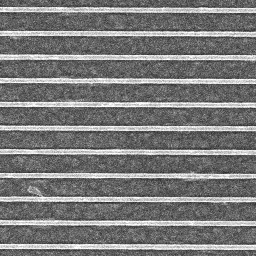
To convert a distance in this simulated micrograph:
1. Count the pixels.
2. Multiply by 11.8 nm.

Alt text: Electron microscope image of parallel lines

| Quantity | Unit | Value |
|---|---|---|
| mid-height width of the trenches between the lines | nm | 228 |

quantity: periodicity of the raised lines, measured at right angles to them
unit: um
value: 0.28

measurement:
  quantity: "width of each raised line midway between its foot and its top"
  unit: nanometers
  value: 44.4